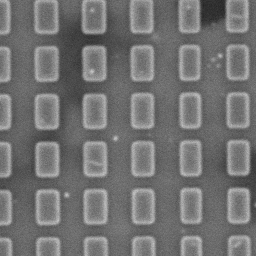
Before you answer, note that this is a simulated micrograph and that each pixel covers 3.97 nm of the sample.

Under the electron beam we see wiring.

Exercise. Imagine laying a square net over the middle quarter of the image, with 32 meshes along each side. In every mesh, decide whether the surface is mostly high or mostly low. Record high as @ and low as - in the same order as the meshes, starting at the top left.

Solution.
-----@@@@@-------@@@@@-------@@@
-----@@@@@-------@@@@@-------@@@
-----@@@@@-------@@@@@-------@@@
-----@@@@@-------@@@@@-------@@@
--------------------------------
--------------------------------
--------------------------------
-------------------@@---------@@
-----@@@@@-------@@@@@-------@@@
-----@@@@@-------@@@@@-------@@@
-----@@@@@-------@@@@@-------@@@
-----@@@@@-------@@@@@-------@@@
-----@@@@@-------@@@@@-------@@@
-----@@@@@-------@@@@@-------@@@
-----@@@@@-------@@@@@-------@@@
-----@@@@@-------@@@@@-------@@@
--------------------------------
--------------------------------
--------------------------------
------------------@@@@--------@@
-----@@@@@-------@@@@@-------@@@
-----@@@@@-------@@@@@-------@@@
-----@@@@@-------@@@@@-------@@@
-----@@@@@-------@@@@@-------@@@
-----@@@@@-------@@@@@-------@@@
-----@@@@@-------@@@@@-------@@@
-----@@@@@-------@@@@@-------@@@
-----@@@@@-------@@@@@--------@@
--------------------------------
--------------------------------
--------------------------------
------------------------------@@